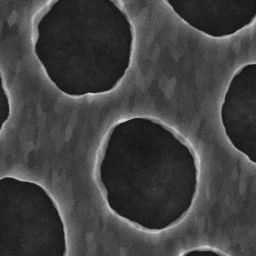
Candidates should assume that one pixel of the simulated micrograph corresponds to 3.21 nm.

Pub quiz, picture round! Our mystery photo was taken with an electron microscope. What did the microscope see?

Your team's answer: holes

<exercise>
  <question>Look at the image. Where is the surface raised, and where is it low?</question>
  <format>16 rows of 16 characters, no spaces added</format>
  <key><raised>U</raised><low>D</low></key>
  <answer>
UUUDDDDDUUUDDDDD
UUDDDDDDUUUUDDDD
UUDDDDDDUUUUUUUU
UUDDDDDDUUUUUUUU
UUUDDDDDUUUUUUUD
UUUUDDDUUUUUUUDD
DUUUUUUUUUUUUUDD
UUUUUUUUDDUUUUDD
UUUUUUUDDDDUUUDD
UUUUUUDDDDDDUUUD
UUUUUUDDDDDDUUUU
DDUUUUDDDDDDUUUU
DDDUUUUDDDDDUUUU
DDDDUUUUDDDDUUUU
DDDDUUUUUUUUUUUU
DDDDUUUUUUUUUUUU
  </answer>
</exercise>